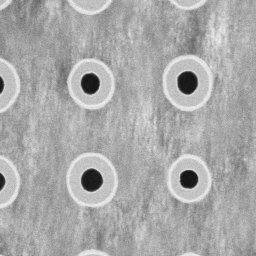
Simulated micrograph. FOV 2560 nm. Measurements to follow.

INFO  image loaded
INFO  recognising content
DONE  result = ring-shaped raised bodies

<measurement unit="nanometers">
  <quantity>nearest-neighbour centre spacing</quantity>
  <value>962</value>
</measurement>